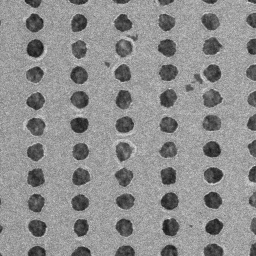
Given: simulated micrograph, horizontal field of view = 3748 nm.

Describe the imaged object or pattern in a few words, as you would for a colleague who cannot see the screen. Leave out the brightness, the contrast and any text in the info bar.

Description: a regular array of holes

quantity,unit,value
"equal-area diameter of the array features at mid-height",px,18.2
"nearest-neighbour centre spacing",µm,0.369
